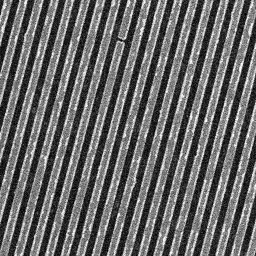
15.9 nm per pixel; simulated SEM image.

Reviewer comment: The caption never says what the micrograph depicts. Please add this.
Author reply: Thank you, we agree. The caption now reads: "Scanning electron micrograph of parallel lines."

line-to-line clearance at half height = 109 nanometres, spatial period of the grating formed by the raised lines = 237 nanometers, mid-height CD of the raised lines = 0.121 micrometres